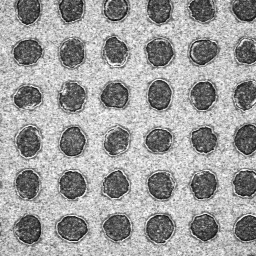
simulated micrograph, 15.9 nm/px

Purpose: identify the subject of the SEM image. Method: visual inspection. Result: a regular array of holes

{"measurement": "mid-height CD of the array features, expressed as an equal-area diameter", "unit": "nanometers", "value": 426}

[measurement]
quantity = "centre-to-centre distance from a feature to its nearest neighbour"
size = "685 nm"